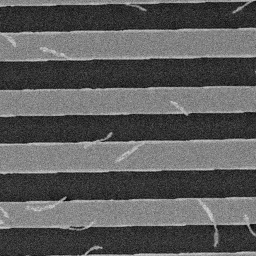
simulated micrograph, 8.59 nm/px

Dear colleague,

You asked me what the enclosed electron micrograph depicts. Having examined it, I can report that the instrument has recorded lines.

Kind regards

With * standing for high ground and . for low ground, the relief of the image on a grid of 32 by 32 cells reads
*************...................
................................
................................
................................
********************************
********************************
********************************
*****...........................
................................
................................
................................
********************************
********************************
********************************
**..............................
................................
................................
.............................***
********************************
********************************
********************************
******..........................
................................
................................
................................
********************************
********************************
********************************
**.....**.*.....................
................................
................................
................................